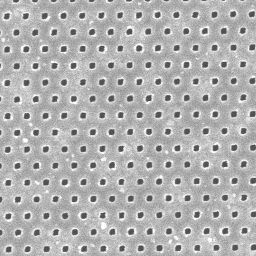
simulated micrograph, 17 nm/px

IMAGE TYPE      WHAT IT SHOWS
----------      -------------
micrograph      a regular array of holes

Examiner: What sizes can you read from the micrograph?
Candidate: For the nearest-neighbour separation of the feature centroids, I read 316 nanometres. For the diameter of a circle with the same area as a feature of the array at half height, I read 114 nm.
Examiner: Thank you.